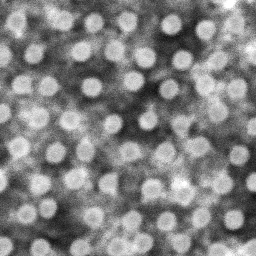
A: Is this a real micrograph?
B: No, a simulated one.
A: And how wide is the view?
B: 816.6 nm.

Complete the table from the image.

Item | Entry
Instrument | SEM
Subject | a regular array of raised bodies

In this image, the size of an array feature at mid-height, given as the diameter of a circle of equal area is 56.9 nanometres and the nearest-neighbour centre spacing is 96.1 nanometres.